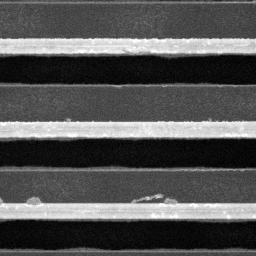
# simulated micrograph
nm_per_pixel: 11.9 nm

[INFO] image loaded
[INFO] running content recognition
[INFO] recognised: lines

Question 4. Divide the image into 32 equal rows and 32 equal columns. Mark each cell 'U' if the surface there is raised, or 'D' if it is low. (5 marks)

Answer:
UUUUUUUUUUUUUUUUUUUUUUUUUUUUUUUU
UUUUUUUUUUUUUUUUUUUUUUUUUUUUUUUU
UUUUUUUUUUUUUUUUUUUUUUUUUUUUUUUU
UUUUUUUUUUUUUUUUUUUUUUUUUUUUUUUU
UUUUUUUUUUUUUUUUUUUUUUUUUUUUUUUU
UUUUUUUUUUUUUUUUUUUUUUUUUUUUUUUU
UUUUUUUUUUUUUUUUUUUUUUUUUUUUUUUU
DDDDDDDDDDDDDDDDDDDDDDDDDDDDDDDD
DDDDDDDDDDDDDDDDDDDDDDDDDDDDDDDD
DDDDDDDDDDDDDDDDDDDDDDDDDDDDDDDD
DDDDDDDDDDDDDDDDDDDDDDDDDDDDDDDD
UUUUUUUUUUUUUUUUUUUUUUUUUUUUUUUU
UUUUUUUUUUUUUUUUUUUUUUUUUUUUUUUU
UUUUUUUUUUUUUUUUUUUUUUUUUUUUUUUU
UUUUUUUUUUUUUUUUUUUUUUUUUUUUUUUU
UUUUUUUUUUUUUUUUUUUUUUUUUUUUUUUU
UUUUUUUUUUUUUUUUUUUUUUUUUUUUUUUU
DDDDDDDDDDDDDDDDDDDDDDDDDDDDDDDD
DDDDDDDDDDDDDDDDDDDDDDDDDDDDDDDD
DDDDDDDDDDDDDDDDDDDDDDDDDDDDDDDD
DDDDDDDDDDDDDDDDDDDDDDDDDDDDDDDD
UUUUUUUUUUUUUUUUUUUUUUUUUUUUUUUU
UUUUUUUUUUUUUUUUUUUUUUUUUUUUUUUU
UUUUUUUUUUUUUUUUUUUUUUUUUUUUUUUU
UUUUUUUUUUUUUUUUUUUUUUUUUUUUUUUU
UUUUUUUUUUUUUUUUUUUUUUUUUUUUUUUU
UUUUUUUUUUUUUUUUUUUUUUUUUUUUUUUU
DDDDDDDDDDDDDDDDDDDDDDDDDDDDDDDD
DDDDDDDDDDDDDDDDDDDDDDDDDDDDDDDD
DDDDDDDDDDDDDDDDDDDDDDDDDDDDDDDD
DDDDDDDDDDDDDDDDDDDDDDDDDDDDDDDD
UUUUUUUUUUUUUUUUUUUUUUUUUUUUUUUU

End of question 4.